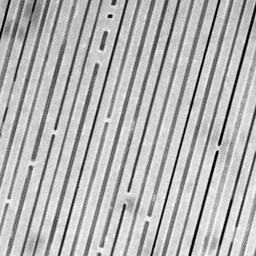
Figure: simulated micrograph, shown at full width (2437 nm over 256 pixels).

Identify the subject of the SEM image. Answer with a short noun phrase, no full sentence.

parallel lines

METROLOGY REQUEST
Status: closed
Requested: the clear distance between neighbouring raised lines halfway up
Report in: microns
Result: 0.0448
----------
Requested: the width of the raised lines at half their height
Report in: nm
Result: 80.4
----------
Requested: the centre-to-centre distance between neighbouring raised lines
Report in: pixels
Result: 12.6